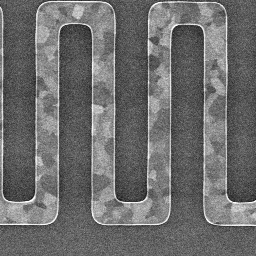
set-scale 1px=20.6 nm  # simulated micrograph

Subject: groups of lines, slits or small figures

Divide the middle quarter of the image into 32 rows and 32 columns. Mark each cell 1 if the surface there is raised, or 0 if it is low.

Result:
00000001111100000000011111000000
00000001111100000000011111000000
00000001111100000000011111000000
00000001111100000000011111000000
00000001111100000000011111100000
00000001111100000000011111100000
00000001111100000000011111100000
00000001111100000000011111100000
00000001111100000000011111100000
00000001111110000000011111100000
00000001111110000000011111100000
00000001111110000000011111100000
00000001111110000000011111100000
00000001111100000000011111100000
00000001111100000000011111000000
00000001111100000000011111000000
00000001111100000000011111000000
00000001111100000000011111000000
00000001111100000000011111000000
00000001111100000000011111000000
00000001111100000000011111000000
00000001111100000000011111000000
00000001111100000000011111000000
00000001111100000000011111000000
00000001111100000000011111000000
00000001111100000000011111000000
00000001111100000000011111000000
00000001111100000000011111000000
00000001111100000000011111000000
00000001111100000000011111000000
00000001111100000000011111000000
00000001111100000000011111000000